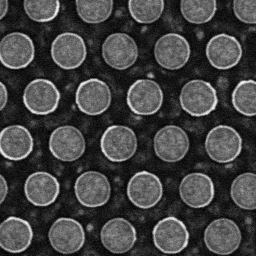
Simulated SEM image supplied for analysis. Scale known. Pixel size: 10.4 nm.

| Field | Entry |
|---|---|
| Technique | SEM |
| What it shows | a regular array of raised bodies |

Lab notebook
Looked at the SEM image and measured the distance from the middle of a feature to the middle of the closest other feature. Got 534 nanometres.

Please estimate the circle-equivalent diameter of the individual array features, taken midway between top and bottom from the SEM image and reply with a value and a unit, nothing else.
364 nm